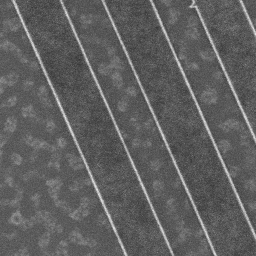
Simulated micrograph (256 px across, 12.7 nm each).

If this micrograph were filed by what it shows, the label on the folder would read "one or a few lines or trenches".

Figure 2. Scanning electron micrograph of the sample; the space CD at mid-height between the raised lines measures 38.8 px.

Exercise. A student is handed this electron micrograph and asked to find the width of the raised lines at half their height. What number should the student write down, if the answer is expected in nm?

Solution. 555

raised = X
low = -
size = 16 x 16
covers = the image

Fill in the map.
-XXX---XXX--XXX-
-XXX---XXX---XXX
--XXX--XXXX--XXX
--XXX---XXX---XX
---XXX--XXX---XX
---XXX---XXX---X
----XXX--XXX---X
----XXX---XXX--X
-----XXX--XXX---
-----XXX---XXX--
-----XXX---XXX--
------XXX---XXX-
------XXX---XXX-
-------XXX--XXX-
-------XXX---XXX
--------XXX--XXX